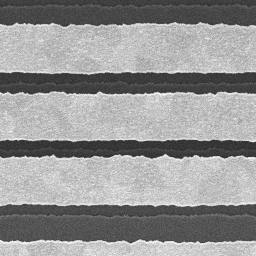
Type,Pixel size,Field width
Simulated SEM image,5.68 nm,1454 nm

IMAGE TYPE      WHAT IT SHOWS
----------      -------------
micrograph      lines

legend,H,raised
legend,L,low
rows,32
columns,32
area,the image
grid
LLLLLLLLLLLLLLLLLLLLLLLLLLLLLLLL
LLLLLLLLLLLLLLLLLLLLLLLLLLLLLLLL
LLLLLLLLLLLLLLLLLLLLLLLLLLLLLLLL
HHHHHHHHHHHHHHHHHHHHHHHHHHHHHHHH
HHHHHHHHHHHHHHHHHHHHHHHHHHHHHHHH
HHHHHHHHHHHHHHHHHHHHHHHHHHHHHHHH
HHHHHHHHHHHHHHHHHHHHHHHHHHHHHHHH
HHHHHHHHHHHHHHHHHHHHHHHHHHHHHHHH
HHHHHHHHHHHHHHHHHHHHHHHHHHHHHHHH
LLLLLLLLLLLLLLLLLLLLLLLLLLLLLLLL
LLLLLLLLLLLLLLLLLLLLLLLLLLLLLLLL
LLLLLLLLLLLLLLLLLLLLLLLLLLLLLLLL
HHHHHHHHHHHHHHHHHHHHHHHHHHHHHHHH
HHHHHHHHHHHHHHHHHHHHHHHHHHHHHHHH
HHHHHHHHHHHHHHHHHHHHHHHHHHHHHHHH
HHHHHHHHHHHHHHHHHHHHHHHHHHHHHHHH
HHHHHHHHHHHHHHHHHHHHHHHHHHHHHHHH
HLLHHLHLHHLHLLLLLHHHHLLLLHHHLLHH
LLLLLLLLLLLLLLLLLLLLLLLLLLLLLLLL
LLLLLLHLLLLLLLHHLHLLHLLLHLLLLLLL
HHHHHHHHHHHHHHHHHHHHHHHHHHHHHHHH
HHHHHHHHHHHHHHHHHHHHHHHHHHHHHHHH
HHHHHHHHHHHHHHHHHHHHHHHHHHHHHHHH
HHHHHHHHHHHHHHHHHHHHHHHHHHHHHHHH
HHHHHHHHHHHHHHHHHHHHHHHHHHHHHHHH
HHHLLHHHHHHHHHHHHHHHHHHHHHHHHHLL
LLLLLLLLLLLLLLLLLLLLLLLLLLLLLLLL
LLLLLLLLLLLLLLLLLLLLLLLLLLLLLLLL
LLLLLLLLLLLLLLLLLLLLLLLLLLLLLLLL
LLLLLLLLLLLLLLLLLLLLLLLLLLLLLLLL
HHHHHHHHHHHHHHHHHHHHHHHHHHHHHHHH
HHHHHHHHHHHHHHHHHHHHHHHHHHHHHHHH